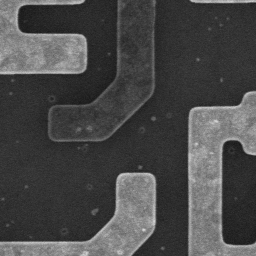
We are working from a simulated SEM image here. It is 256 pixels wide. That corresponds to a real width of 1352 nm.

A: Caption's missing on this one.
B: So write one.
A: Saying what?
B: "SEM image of wiring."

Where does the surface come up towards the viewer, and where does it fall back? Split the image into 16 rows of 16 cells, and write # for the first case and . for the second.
#......###......
#......###......
#####..###......
#####..###......
#####..###......
.......###......
.....####......#
...#####....####
...####.....####
............##..
............##..
.......###..##..
.......###..##..
.......###..##..
......####..##..
#########...####